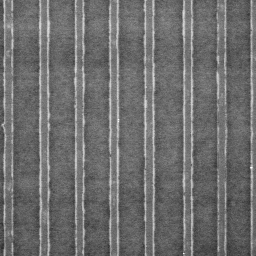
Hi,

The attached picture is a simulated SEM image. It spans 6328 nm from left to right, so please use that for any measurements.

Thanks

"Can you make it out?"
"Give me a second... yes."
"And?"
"parallel lines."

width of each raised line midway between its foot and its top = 195 nanometers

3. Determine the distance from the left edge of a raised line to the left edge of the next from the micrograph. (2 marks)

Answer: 0.879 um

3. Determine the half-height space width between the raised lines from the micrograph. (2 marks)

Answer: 671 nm